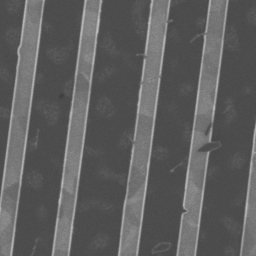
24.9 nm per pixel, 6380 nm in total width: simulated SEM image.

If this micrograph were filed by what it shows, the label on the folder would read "one or a few lines or trenches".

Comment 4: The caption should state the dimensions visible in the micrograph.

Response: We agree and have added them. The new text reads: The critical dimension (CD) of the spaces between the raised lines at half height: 41.7 px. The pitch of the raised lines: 1520 nm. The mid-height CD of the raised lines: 0.432 um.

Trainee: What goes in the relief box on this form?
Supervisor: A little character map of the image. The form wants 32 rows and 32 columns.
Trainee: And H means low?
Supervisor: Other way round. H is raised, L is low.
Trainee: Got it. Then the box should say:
LLLHHLLLLLLHHLLLLLLHHLLLLLHHLLLL
LLLHHLLLLLHHLLLLLLLHHLLLLLHHLLLL
LLLHHLLLLLHHLLLLLLLHHLLLLLHHLLLL
LLLHHLLLLLHHLLLLLLLHHLLLLLHHLLLL
LLLHHLLLLLHHLLLLLLHHHLLLLLHHLLLL
LLLHHLLLLLHHLLLLLLHHHLLLLLHHLLLL
LLHHHLLLLLHHLLLLLLHHLLLLLHHHLLLL
LLHHHLLLLLHHLLLLLLHHLLLLLHHHLLLL
LLHHLLLLLLHHLLLLLLHHLLLLLHHLLLLL
LLHHLLLLLLHLLLLLLLHHLLLLLHHLLLLL
LLHHLLLLLHHLLLLLLLHHLLLLLHHLLLLL
LLHHLLLLLHHLLLLLLLHHLLLLLHHLLLLL
LLHHLLLLLHHLLLLLLHHHLLLLLHHLLLLL
LLHHLLLLLHHLLLLLLHHHLLLLLHHLLLLL
LHHHLLLLLHHLLLLLLHHLLLLLHHHLLLLL
LHHHLLLLLHHLLLLLLHHLLLLLHHHLLLLL
LHHLLLLLLHHLLLLLLHHLLLLLHHLLLLLL
LHHLLLLLHHLLLLLLLHHLLLLLHHLLLLLL
LHHLLLLLHHLLLLLLLHHLLLLLHHHLLLLL
LHHLLLLLHHLLLLLLLHHLLLLLHHLLLLLL
LHHLLLLLHHLLLLLLHHHLLLLLHHLLLLLH
LHHLLLLLHHLLLLLLHHLLLLLHHHLLLLLH
HHHLLLLLHHLLLLLLHHLLLLLHHHLLLLLH
HHLLLLLLHHLLLLLLHHLLLLLHHLLLLLLH
HHLLLLLLHHLLLLLLHHLLLLLHHLLLLLLH
HHLLLLLHHLLLLLLLHHLLLLLHHLLLLLLH
HHLLLLLHHLLLLLLHHHLLLLLHHLLLLLLH
HHLLLLLHHLLLLLLHHHLLLLLHHLLLLLLH
HHLLLLLHHLLLLLLHHHLLLLLHHLLLLLHH
HHLLLLLHHLLLLLLHHLLLLLHHHLLLLLHH
HHLLLLLHHLLLLLLHHLLLLLHHHLLLLLHH
HLLLLLLHHLLLLLLHHLLLLLHHLLLLLLHH